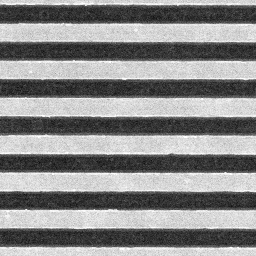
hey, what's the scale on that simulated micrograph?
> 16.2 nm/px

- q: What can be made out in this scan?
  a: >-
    parallel lines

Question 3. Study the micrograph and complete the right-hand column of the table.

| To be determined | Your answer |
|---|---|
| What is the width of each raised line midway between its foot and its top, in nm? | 329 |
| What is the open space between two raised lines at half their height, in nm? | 276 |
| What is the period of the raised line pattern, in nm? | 606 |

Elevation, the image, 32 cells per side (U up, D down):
UUUUUUUUUUUUUUUUUUUUUUUUUUUUUUUU
DDDDDDDDDDDDDDDDDDDDDDDDDDDDDDDD
DDDDDDDDDDDDDDDDDDDDDDDDDDDDDDDD
UUUUUUUUUUUUUUUUUUUUUUUUUUUUUUUU
UUUUUUUUUUUUUUUUUUUUUUUUUUUUUUUU
DDDDDDDDDDDDDDDDDDDDDDDDDDDDDDDD
DDDDDDDDDDDDDDDDDDDDDDDDDDDDDDDD
DDDDDDDDDDDDDDDDDDDDDDDDDDDDDDDD
UUUUUUUUUUUUUUUUUUUUUUUUUUUUUUUU
UUUUUUUUUUUUUUUUUUUUUUUUUUUUUUUU
DDDDDDDDDDDDDDDDDDDDDDDDDDDDDDDD
DDDDDDDDDDDDDDDDDDDDDDDDDDDDDDDD
UUUUUUUUUUUUUUUUUUUUUUUUUUUUUUUU
UUUUUUUUUUUUUUUUUUUUUUUUUUUUUUUU
UUUUUUUUUUUUUUUUUUUUUUUUUUUUUUUU
DDDDDDDDDDDDDDDDDDDDDDDDDDDDDDDD
DDDDDDDDDDDDDDDDDDDDDDDDDDDDDDDD
UUUUUUUUUUUUUUUUUUUUUUUUUUUUUUUU
UUUUUUUUUUUUUUUUUUUUUUUUUUUUUUUU
DDDDDDDDDDDDDDDDDDDDDDDDDDDDDDDD
DDDDDDDDDDDDDDDDDDDDDDDDDDDDDDDD
DDDDDDDDDDDDDDDDDDDDDDDDDDDDDDDD
UUUUUUUUUUUUUUUUUUUUUUUUUUUUUUUU
UUUUUUUUUUUUUUUUUUUUUUUUUUUUUUUU
DDDDDDDDDDDDDDDDDDDDDDDDDDDDDDDD
DDDDDDDDDDDDDDDDDDDDDDDDDDDDDDDD
UUUUUUUUUUUUUUUUUUUUUUUUUUUUUUUU
UUUUUUUUUUUUUUUUUUUUUUUUUUUUUUUU
UUUUUUUUUUUUUUUUUUUUUUUUUUUUUUUU
DDDDDDDDDDDDDDDDDDDDDDDDDDDDDDDD
DDDDDDDDDDDDDDDDDDDDDDDDDDDDDDDD
UUUUUUUUUUUUUUUUUUUUUUUUUUUUUUUU